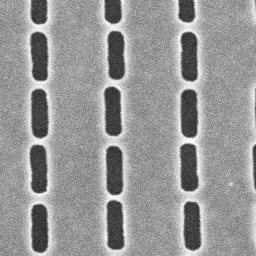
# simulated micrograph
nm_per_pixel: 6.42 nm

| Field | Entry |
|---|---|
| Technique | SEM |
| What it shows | a regular array of holes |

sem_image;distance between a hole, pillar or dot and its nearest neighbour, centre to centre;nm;355